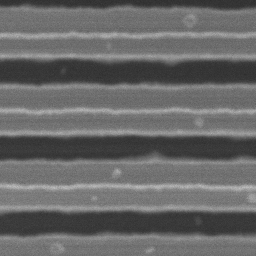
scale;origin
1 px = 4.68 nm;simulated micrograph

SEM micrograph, lines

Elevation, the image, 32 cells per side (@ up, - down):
--------------------------------
@@@@@@@@@@@@@@@@@@@@@@@@@@@@@@@@
@@@@@@@@@@@@@@@@@@@@@@@@@@@@@@@@
@@@@@@@@@@@@@@@@@@@@@@@@@@@@@@@@
@@@@@@@@@@@@@@@@@@@@@@@@@@@@@@@@
@@@@@@@@@@@@@@@@@@@@@@@@@@@@@@@@
@@@@@@@@@@@@@@@@@@@@@@@@@@@@@@@@
---------------------@----------
--------------------------------
--------------------------------
--------------------------------
@@@@@@@@@@@@@@@@@@@@@@@@@@@@@@@@
@@@@@@@@@@@@@@@@@@@@@@@@@@@@@@@@
@@@@@@@@@@@@@@@@@@@@@@@@@@@@@@@@
@@@@@@@@@@@@@@@@@@@@@@@@@@@@@@@@
@@@@@@@@@@@@@@@@@@@@@@@@@@@@@@@@
@@@@@@@@@@@@@@@@@@@@@@@@@@@@@@@@
--------------------------------
--------------------------------
--------------------------------
@@@@@@@@@@@@@@@@@@@@@@@@@@@@@@@@
@@@@@@@@@@@@@@@@@@@@@@@@@@@@@@@@
@@@@@@@@@@@@@@@@@@@@@@@@@@@@@@@@
@@@@@@@@@@@@@@@@@@@@@@@@@@@@@@@@
@@@@@@@@@@@@@@@@@@@@@@@@@@@@@@@@
@@@@@@@@@@@@@@@@@@@@@@@@@@@@@@@@
--------------------------------
--------------------------------
--------------------------------
-----@@@@---@@@-@@@@@---@-------
@@@@@@@@@@@@@@@@@@@@@@@@@@@@@@@@
@@@@@@@@@@@@@@@@@@@@@@@@@@@@@@@@